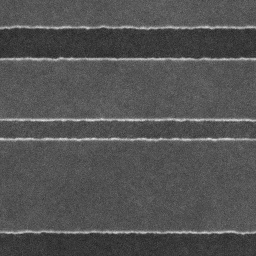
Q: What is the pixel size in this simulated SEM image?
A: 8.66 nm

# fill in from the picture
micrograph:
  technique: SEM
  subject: lines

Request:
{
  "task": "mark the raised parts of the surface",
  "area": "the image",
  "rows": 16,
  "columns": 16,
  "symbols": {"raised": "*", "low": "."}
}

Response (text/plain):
****************
****************
................
................
****************
****************
****************
****************
****************
****************
****************
****************
****************
****************
****************
................